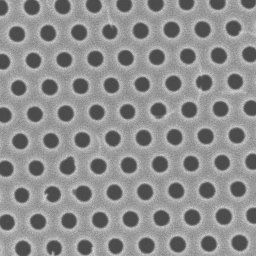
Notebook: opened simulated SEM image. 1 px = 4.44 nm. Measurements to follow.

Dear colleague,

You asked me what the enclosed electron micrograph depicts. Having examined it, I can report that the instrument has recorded a regular array of holes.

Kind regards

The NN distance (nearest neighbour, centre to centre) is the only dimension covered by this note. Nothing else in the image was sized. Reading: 136 nm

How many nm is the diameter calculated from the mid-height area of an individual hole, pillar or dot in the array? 68.4